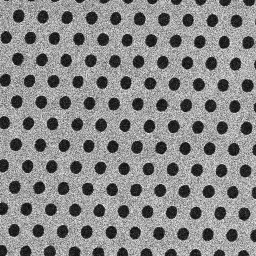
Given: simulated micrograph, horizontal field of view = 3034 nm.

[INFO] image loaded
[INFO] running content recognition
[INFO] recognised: a regular array of holes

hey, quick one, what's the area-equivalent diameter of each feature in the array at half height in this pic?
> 149 nanometers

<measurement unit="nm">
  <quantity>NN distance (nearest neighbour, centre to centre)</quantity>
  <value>286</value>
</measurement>